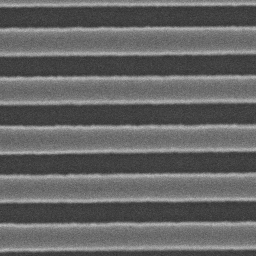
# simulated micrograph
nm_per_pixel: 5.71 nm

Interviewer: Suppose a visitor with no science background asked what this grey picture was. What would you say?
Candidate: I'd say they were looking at lines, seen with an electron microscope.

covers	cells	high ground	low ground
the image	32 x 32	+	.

++++++++++++++++++++++++++++++++
................................
................................
............................++..
++++++++++++++++++++++++++++++++
++++++++++++++++++++++++++++++++
++++++++++++++++++++++++++++++++
................................
................................
................................
++++++++++++++++++++++++++++++++
++++++++++++++++++++++++++++++++
++++++++++++++++++++++++++++++++
................................
................................
................................
++++++++++++++++++++++++++++++++
++++++++++++++++++++++++++++++++
++++++++++++++++++++++++++++++++
................................
................................
................................
++++++++++++++++++++++++++++++++
++++++++++++++++++++++++++++++++
++++++++++++++++++++++++++++++++
................................
................................
................................
++++++++++++++++++++++++++++++++
++++++++++++++++++++++++++++++++
++++++++++++++++++++++++++++++++
................................